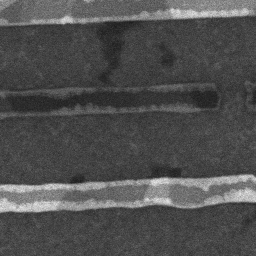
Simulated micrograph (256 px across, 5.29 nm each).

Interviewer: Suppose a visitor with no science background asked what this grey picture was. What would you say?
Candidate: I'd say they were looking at one or a few lines or trenches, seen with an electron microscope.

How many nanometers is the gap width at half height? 358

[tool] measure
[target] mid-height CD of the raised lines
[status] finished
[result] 133 nm